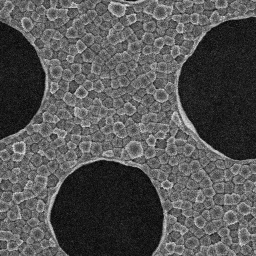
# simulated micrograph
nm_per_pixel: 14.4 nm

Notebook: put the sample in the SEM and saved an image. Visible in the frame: holes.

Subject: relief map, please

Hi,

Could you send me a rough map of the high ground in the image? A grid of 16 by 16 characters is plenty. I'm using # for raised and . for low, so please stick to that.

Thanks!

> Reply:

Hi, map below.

################
##############..
..###########...
..##########....
...########.....
...########.....
...########.....
..##########....
.###########....
##############..
#####....#######
####......######
###.......######
###.......######
###.......######
####......######